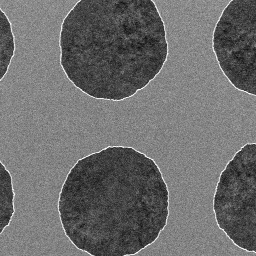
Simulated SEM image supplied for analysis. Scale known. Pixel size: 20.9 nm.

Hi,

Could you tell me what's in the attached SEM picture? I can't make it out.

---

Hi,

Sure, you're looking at holes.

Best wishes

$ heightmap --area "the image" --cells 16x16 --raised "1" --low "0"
1111100000111100
0111000000111100
0111000000111000
0111000000111100
1111000000111100
1111100001111110
1111111111111111
1111111111111111
1111111111111111
1111110001111110
1111100000111100
0111000000111100
0111000000111000
0111000000111000
1111000000111100
1111100001111110